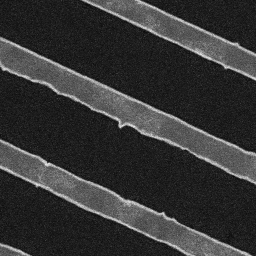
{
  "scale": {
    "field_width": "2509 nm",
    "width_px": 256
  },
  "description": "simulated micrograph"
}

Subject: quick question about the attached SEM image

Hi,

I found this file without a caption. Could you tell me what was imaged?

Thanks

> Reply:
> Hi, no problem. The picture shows one or a few lines or trenches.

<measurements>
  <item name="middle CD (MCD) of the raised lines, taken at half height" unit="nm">238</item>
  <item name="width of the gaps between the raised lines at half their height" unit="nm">670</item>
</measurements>